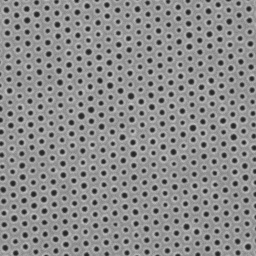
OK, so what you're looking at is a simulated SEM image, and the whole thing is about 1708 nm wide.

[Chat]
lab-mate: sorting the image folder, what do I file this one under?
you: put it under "a regular array of holes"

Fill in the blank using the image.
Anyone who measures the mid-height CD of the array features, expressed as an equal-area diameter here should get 0.0361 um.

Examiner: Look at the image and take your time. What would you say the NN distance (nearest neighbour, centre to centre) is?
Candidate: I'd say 75.4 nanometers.